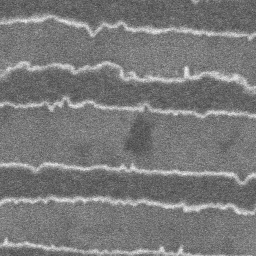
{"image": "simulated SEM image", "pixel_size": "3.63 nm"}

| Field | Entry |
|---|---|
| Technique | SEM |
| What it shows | one or a few lines or trenches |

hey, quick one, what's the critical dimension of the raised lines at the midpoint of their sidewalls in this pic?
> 129 nm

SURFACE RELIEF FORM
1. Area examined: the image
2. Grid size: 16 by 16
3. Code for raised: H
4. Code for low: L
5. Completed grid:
HHHHHHHHHHHHHHHH
LLLLLHHHHHHHHHHH
LLLLLLLLLLLLLLLL
LLLLLLLLLLLLLLLL
HHHHHHHHLLLLLLLL
HHHHHHHHHHHHHHHH
HHHHHLHHHHHHHHHH
LLLLLLLLLLLLLLLL
LLLLLLLLLLLLLLLL
LLLLLLLLLLLLLLLL
HHHHHHHLLLLLLLLL
HHHHHHHHHHHHHHHH
HHHLHHLHHHHHHHHH
LLLLLLLLLLLLLLLL
LLLLLLLLLLLLLLLL
HHHHLLLLLLLLLLLL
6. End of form